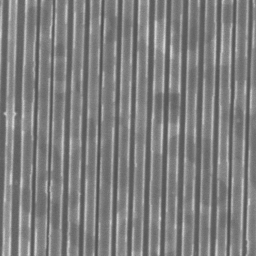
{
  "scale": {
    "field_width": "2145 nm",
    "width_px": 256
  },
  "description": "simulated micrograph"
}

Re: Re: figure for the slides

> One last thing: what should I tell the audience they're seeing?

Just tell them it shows parallel lines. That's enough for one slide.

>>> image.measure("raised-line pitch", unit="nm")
137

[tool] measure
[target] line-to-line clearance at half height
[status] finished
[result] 50.3 nm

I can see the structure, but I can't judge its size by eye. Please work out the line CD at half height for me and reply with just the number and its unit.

11 pixels